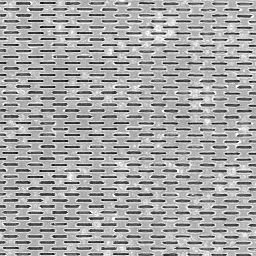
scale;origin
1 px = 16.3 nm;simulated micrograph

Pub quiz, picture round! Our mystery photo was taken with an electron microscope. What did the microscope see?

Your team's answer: a regular array of holes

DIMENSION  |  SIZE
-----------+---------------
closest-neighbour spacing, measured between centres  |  195 nanometers